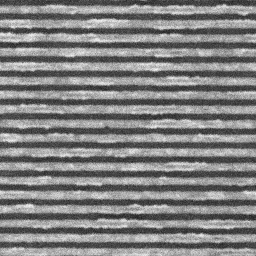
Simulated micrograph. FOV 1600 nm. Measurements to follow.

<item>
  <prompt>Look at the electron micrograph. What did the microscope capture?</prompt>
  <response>parallel lines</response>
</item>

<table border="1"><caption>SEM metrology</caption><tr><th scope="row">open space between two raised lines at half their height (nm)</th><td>43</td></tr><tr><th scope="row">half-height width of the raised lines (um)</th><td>0.043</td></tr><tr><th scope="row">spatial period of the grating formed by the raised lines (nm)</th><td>89.2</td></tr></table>